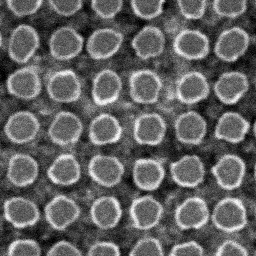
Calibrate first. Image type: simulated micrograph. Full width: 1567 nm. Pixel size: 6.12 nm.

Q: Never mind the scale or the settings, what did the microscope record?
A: a regular array of raised bodies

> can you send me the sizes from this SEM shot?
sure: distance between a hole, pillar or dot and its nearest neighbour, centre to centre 243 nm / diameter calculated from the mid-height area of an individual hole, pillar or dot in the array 0.188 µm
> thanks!